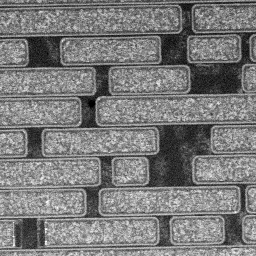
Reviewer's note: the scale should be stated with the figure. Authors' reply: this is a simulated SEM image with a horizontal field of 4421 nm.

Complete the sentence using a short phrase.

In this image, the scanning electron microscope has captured parallel lines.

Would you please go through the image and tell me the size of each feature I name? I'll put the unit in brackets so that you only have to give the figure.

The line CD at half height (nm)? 60.4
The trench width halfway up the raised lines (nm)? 462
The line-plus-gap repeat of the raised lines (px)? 30.2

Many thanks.